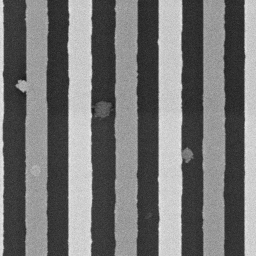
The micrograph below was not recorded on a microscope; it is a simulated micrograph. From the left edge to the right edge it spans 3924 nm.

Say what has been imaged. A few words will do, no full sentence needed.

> lines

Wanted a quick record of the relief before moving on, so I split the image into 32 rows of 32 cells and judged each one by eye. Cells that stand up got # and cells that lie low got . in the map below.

...###...##...###...###...##...#
...###...##...###...###...##...#
...###...##....##...###...##...#
...###...##....##...###...##...#
...###...##...###...###...##...#
...###...##...###...###...##...#
...###...##...###...###...##...#
...###...##....##...###...##...#
...###...##....##...###...##...#
...###...##....##...###...##...#
..####...##...###...###...##...#
...###...##...###...###..###...#
...###...##...###...###...##...#
...###...##....##...###...##...#
...###...##...###...###...##...#
...###...##...###...###...##...#
...###...##...###...###...##...#
...###...##...###...###..###...#
...###...##....##...###..###...#
...###...##....##...###..###...#
...###...##....##...###..###...#
...###...##....##...###..###...#
...###...##...###...###...##...#
...###...##...###...###...##...#
...###...##....##...###...##...#
...###...##...###...###..###...#
...###...##...###...###..###...#
...###...##...###...###..###...#
...###...##...###...###..###...#
...###...##...###...###...##...#
...###...##....##...###...##...#
...###...##...###...###...##...#